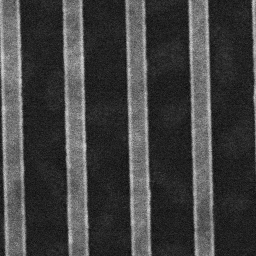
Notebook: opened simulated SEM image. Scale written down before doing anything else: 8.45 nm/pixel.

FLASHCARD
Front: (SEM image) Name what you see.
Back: one or a few lines or trenches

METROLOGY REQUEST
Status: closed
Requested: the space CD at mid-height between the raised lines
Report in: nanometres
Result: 393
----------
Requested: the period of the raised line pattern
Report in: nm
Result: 532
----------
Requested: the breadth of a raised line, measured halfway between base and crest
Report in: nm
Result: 136